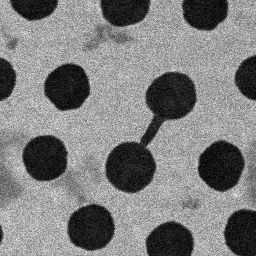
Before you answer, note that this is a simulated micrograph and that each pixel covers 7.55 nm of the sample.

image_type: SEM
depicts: holes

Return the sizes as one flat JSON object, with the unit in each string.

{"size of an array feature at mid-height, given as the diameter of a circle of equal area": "353 nm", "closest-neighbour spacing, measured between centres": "596 nm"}